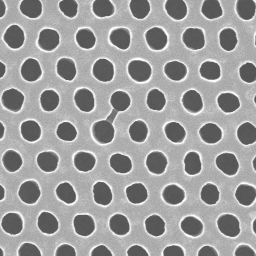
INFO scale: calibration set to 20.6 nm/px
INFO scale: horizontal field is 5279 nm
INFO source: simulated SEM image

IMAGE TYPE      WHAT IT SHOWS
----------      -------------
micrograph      a regular array of holes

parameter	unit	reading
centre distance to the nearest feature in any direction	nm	719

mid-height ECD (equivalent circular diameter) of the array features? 434 nanometres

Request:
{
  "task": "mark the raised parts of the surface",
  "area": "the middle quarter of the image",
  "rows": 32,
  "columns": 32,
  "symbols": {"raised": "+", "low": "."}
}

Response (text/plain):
...++++.....++++......+++......+
...++++......+++......+++......+
...++++......+++......+++......+
..++++++....+++++....+++++....++
++++++++++++++++++++++++++++++++
++++++++++++++++++++++++++++++++
++++..++++++++++++++++..++++++++
+++....+++++....+++++....+++++..
++......++++....+++++....+++++..
+++.....++++.....++++.....++++..
+++....+++++....+++++....+++++..
++++...++++++..++++++++.+++++++.
++++++++++++++++++++++++++++++++
++++++++++++++++++++++++++++++++
.++++++++..+++++++..+++++++..+++
..+++++.....+++++....++++....+++
...++++......+++.....++++.....++
...++++......+++.....++++.....++
...+++++....+++++....+++++....++
+++++++++..+++++++..+++++++..+++
++++++++++++++++++++++++++++++++
++++++++++++++++++++++++++++++++
+++....++++++.+++++++....++++++.
+++.....++++....+++++....+++++..
++......+++......+++......++++..
+++.....++++.....++++.....++++..
++++...+++++.....++++....+++++..
+++++++++++++++++++++++.+++++++.
++++++++++++++++++++++++++++++++
++++++++++++++++++++++++++++++++
..++++++...+++++....++++++..++++
..+++++.....+++......++++.....++